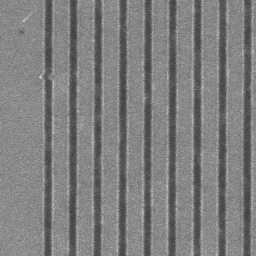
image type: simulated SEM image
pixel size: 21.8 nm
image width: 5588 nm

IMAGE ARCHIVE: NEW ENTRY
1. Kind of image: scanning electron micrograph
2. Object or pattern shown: parallel lines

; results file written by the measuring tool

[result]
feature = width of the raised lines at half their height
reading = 224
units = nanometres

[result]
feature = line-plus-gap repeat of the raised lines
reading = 0.543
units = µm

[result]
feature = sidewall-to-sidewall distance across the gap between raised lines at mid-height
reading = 322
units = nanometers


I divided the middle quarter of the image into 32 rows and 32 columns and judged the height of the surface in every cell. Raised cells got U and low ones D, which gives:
DUUUDDDUUUDDDDUUDDDDUUDDDDUUDDDD
DUUUDDDUUUDDDDUUDDDDUUDDDDUUDDDD
DDUUDDDUUUDDDDUUDDDDUUDDDDUUDDDD
DUUUDDDUUUDDDDUUDDDDUUDDDDDUDDDD
DUUUDDDUUUDDDDUUDDDDUUDDDDUUDDDD
DUUDDDDUUUDDDDUUDDDDUUDDDDUUDDDD
DUUDDDDUUUDDDDUUDDDDUUDDDDUUDDDD
DUUDDDDUUUDDDDUUDDDDUUDDDDUUDDDD
DUUDDDDUUUDDDDUUDDDDUUDDDDUUDDDD
DUUDDDDUUUDDDDUUDDDDUUDDDDUUDDDD
DUUDDDDUUUDDDDUUDDDDUUDDDDUUDDDD
DUUDDDDUUUDDDDUUDDDDUUDDDDUUDDDD
DUUDDDDUUUDDDDUUDDDDUUDDDDUUDDDD
DUUDDDDUUUDDDDUUDDDDUUDDDDUUDDDD
DUUDDDDUUUDDDDUUDDDDUUDDDDUUDDDD
DUUDDDDUUUDDDDUUDDDDUUDDDDUUDDDD
DUUDDDDUUUDDDDUUDDDDUUDDDDUUDDDD
DUUDDDDUUUDDDDUUDDDDUUDDDDUUDDDD
DUUDDDDUUUDDDDUUDDDDUUDDDDUUDDDD
DUUDDDDUUUDDDDUUDDDDUUDDDDUUDDDD
DUUDDDDUUUDDDDUUDDDDUUDDDDUUDDDD
DUUDDDDUUUDDDDUUDDDDUUDDDDUUDDDD
DUUDDDDUUUDDDDUUDDDDUUDDDDUUDDDD
DUUDDDDUUUDDDDUUDDDDUUDDDDUUDDDD
DUUDDDDUUUDDDDUUDDDDUUDDDDUUDDDD
DUUDDDDUUUDDDDUUDDDDUUDDDDUUDDDD
DUUDDDDUUUDDDUUUDDDDUUDDDDUUDDDD
DUUDDDDUUUDDDUUUDDDDUUDDDDUUDDDD
DUUDDDDUUUDDDUUUDDDDUUDDDDUUDDDD
DUUDDDDUUUDDDUUUDDDDUUDDDDUUDDDD
DUUDDDDUUUDDDUUUDDDDUUDDDDUUDDDD
DUUDDDDUUUDDDUUUDDDDUUDDDDUUDDDD